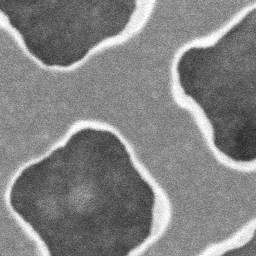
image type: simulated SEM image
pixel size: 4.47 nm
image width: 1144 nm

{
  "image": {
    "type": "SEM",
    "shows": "holes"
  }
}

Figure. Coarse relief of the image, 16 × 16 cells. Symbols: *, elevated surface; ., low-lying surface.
.........*******
*........******.
*......*******..
**...******.....
***********.....
***********.....
************....
*************...
*****..******...
***.....******..
**.......*******
*........*******
*.........******
*.........******
**........*****.
***......*****..